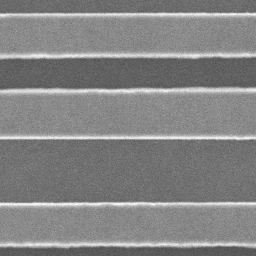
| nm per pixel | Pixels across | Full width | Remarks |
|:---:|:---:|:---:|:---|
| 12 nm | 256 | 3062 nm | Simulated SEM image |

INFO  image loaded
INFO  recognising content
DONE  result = lines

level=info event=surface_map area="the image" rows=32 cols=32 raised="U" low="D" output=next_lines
DDDDDDDDDDDDDDDDDDDDDDDDDDDDDDDD
DDDDDDDDDDDDDDDDDDDDDDDDDDDDDDDD
UUUUUUUUUUUUUUUUUUUUUUUUUUUUUUUU
UUUUUUUUUUUUUUUUUUUUUUUUUUUUUUUU
UUUUUUUUUUUUUUUUUUUUUUUUUUUUUUUU
UUUUUUUUUUUUUUUUUUUUUUUUUUUUUUUU
UUUUUUUUUUUUUUUUUUUUUUUUUUUUUUUU
DDDDDDDDDDDDDDDDDDDDDDDDDDDDDDDD
DDDDDDDDDDDDDDDDDDDDDDDDDDDDDDDD
DDDDDDDDDDDDDDDDDDDDDDDDDDDDDDDD
DDDDDDDDDDDDDDDDDDDDDDDDDDDDDDDD
UUUUUUUUUUUUUUUUUUUUUUUUUUUUUUUU
UUUUUUUUUUUUUUUUUUUUUUUUUUUUUUUU
UUUUUUUUUUUUUUUUUUUUUUUUUUUUUUUU
UUUUUUUUUUUUUUUUUUUUUUUUUUUUUUUU
UUUUUUUUUUUUUUUUUUUUUUUUUUUUUUUU
UUUUUUUUUUUUUUUUUUUUUUUUUUUUUUUU
DDDDDDDDDDDDDDDDDDDDDDDDDDDDDDDD
DDDDDDDDDDDDDDDDDDDDDDDDDDDDDDDD
DDDDDDDDDDDDDDDDDDDDDDDDDDDDDDDD
DDDDDDDDDDDDDDDDDDDDDDDDDDDDDDDD
DDDDDDDDDDDDDDDDDDDDDDDDDDDDDDDD
DDDDDDDDDDDDDDDDDDDDDDDDDDDDDDDD
DDDDDDDDDDDDDDDDDDDDDDDDDDDDDDDD
DDDDDDDDDDDDDDDDDDDDDDDDDDDDDDDD
UUDDUDDDUUUUUUUUUUUUUUUUUUUUUUUU
UUUUUUUUUUUUUUUUUUUUUUUUUUUUUUUU
UUUUUUUUUUUUUUUUUUUUUUUUUUUUUUUU
UUUUUUUUUUUUUUUUUUUUUUUUUUUUUUUU
UUUUUUUUUUUUUUUUUUUUUUUUUUUUUUUU
UUUUUUUUUUUUUUUUUUUUUUUUUUUUUUUU
DDDDDDDDDDDDDDDDDDDDDDDDDDDDDDDD